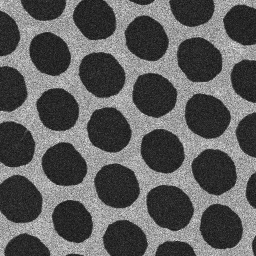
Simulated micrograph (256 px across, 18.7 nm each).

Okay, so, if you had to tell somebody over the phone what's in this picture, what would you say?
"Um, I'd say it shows a regular array of holes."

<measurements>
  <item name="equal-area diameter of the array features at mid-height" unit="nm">828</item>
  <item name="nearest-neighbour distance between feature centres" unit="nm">1050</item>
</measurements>